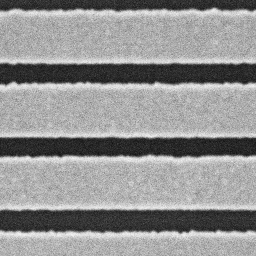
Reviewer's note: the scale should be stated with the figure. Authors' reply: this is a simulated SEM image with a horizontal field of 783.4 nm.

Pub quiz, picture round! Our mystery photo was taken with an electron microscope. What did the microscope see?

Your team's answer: lines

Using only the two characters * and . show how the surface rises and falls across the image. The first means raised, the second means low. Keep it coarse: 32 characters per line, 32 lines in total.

................................
********************************
********************************
********************************
********************************
********************************
********************************
********************************
................................
................................
.*.******************.********.*
********************************
********************************
********************************
********************************
********************************
********************************
................................
................................
..................**........*...
********************************
********************************
********************************
********************************
********************************
********************************
................................
................................
................................
********************************
********************************
********************************